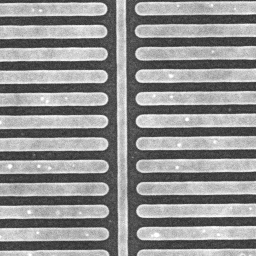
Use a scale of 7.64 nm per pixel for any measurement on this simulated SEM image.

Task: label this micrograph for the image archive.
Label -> groups of lines, slits or small figures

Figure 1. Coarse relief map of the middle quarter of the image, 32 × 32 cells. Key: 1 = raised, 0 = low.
00000000000001100000000000000000
00000000000001100001111111111111
11111111111001100011111111111111
11111111111001100011111111111111
11111111110001100001111111111100
00000000000001100000000000000000
00000000000001100000000000000000
11111111110001100001111111111111
11111111111001100011111111111111
11111111111001100011111111111111
00000000000001100000000000000000
00000000000001100000000000000000
00000000000001110000000000000000
11111111111001110011111111111111
11111111111001110011111111111111
11111111110001110001111111111111
00000000000001110000000000000000
00000000000001110000000000000000
00000111100001110001111111111111
11111111111001110011111111111111
11111111111001110011111111111111
11111111110000110000000000000000
00000000000001110000000000000000
00000000000001110000000000000000
11111111110000110001111111111111
11111111111000110011111111111111
11111111111000110011111111111111
00000000000000110000000000000000
00000000000000110000000000000000
00000000000000110000000000011111
11111111111000110011111111111111
11111111111000110011111111111111